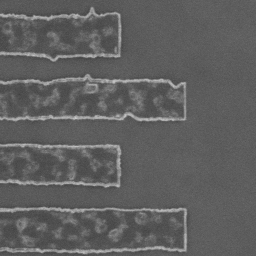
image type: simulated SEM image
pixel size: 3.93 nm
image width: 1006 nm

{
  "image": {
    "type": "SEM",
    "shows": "one or a few lines or trenches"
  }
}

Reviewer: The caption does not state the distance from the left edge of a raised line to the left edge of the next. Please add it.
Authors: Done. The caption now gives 255 nm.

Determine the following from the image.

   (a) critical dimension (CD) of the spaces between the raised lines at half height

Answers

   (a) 98.3 nanometres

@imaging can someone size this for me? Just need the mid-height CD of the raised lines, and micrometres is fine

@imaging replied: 0.155